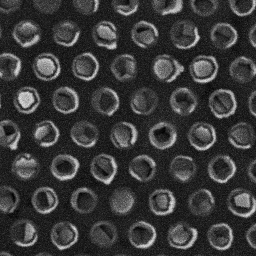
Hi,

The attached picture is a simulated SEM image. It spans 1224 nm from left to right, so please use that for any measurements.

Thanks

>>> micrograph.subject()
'a regular array of raised bodies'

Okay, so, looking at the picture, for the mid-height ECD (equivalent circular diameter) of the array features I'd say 0.123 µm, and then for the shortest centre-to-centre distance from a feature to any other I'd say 182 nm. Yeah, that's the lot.